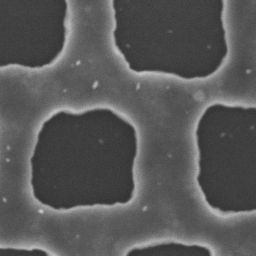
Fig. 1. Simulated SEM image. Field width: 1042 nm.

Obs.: holes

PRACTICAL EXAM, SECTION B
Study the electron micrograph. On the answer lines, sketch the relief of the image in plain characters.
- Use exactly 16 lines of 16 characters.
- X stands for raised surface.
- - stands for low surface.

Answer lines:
----XXX-------XX
----XXX-------XX
----XXX-------XX
----XXXX------XX
XXXXXXXXXX---XXX
XXXXXXXXXXXXXXXX
XXXXXXXXXXXXXXXX
XXX-----XXXXX---
XX-------XXX----
XX------XXXX----
XX------XXXX----
XX------XXXX----
XX------XXXXX---
XXXXXXXXXXXXXXXX
XXXXXXXXXXXXXXXX
XXXXXXXXX----XXX